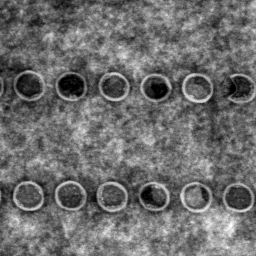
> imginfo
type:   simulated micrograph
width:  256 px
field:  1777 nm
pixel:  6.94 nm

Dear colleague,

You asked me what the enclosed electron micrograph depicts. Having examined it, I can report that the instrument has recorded a regular array of raised bodies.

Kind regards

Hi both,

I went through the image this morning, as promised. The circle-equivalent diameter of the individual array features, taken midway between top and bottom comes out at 198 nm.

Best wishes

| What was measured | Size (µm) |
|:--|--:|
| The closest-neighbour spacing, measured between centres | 0.29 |